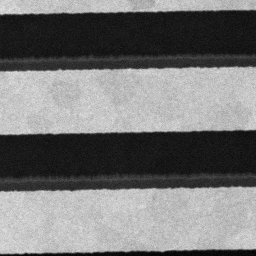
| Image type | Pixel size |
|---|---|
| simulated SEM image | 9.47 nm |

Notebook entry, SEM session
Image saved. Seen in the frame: lines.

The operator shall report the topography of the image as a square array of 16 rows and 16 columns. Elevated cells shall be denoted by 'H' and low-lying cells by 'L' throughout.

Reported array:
HHHHHHHHHHHHHHHH
LLLLLLLLLLLLLLLL
LLLLLLLLLLLLLLLL
LLLLLLLLLLLLLLLL
LHHHHHHHHHHHHHHH
HHHHHHHHHHHHHHHH
HHHHHHHHHHHHHHHH
HHHHHHHHHHHHHHHH
LLLLLLLLLLLLLLLL
LLLLLLLLLLLLLLLL
LLLLLLLLLLLLLLLL
LLLLLLLLLLLLLLLL
HHHHHHHHHHHHHHHH
HHHHHHHHHHHHHHHH
HHHHHHHHHHHHHHHH
HHHHHHHHHHHHHHHH